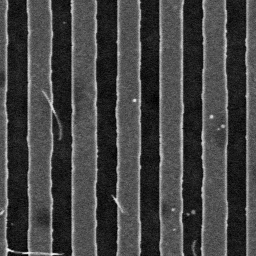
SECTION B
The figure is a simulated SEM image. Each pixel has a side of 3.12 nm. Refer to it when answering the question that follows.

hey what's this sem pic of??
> lines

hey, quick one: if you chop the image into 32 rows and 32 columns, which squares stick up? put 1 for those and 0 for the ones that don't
10011100011100011000111001110001
10011100011100011100111001110001
10001100011100011100111001110001
10001110011100011100111001110001
10001110011100011000111001110001
10001100011100011100111001110001
10001100011100011100111001110001
10001100011100011100111001110001
10001100011100011100111001110001
10001100011100011000111001110001
10001100011100011100111001110001
10001110011100011100111001110001
10001110011100011100111001110001
10001110011100011100111001110001
10001100011100011100111001110001
10001100011100011100111001110001
10001110011100011100111001110001
10011110011100011100111001110001
10001110011100011100111001110001
10001100011100011100111001110001
10001100011100011100111001110001
10001100011100011100111001110001
10001100011100011000111001110001
10001100011100011000111001110001
10001100011100111000111001110001
10001110011100011000111001110001
10001110011100011000111001110001
10001100011100011100111001110001
10001110011100011100111001110001
10001110011100011100111001110001
10001110011100011100111001110001
10011110011100011100111001110001